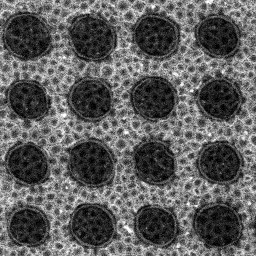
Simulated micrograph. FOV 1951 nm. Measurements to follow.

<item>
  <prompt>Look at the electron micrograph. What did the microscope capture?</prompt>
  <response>a regular array of raised bodies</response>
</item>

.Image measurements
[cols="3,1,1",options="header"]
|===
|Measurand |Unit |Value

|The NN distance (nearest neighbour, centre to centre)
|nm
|476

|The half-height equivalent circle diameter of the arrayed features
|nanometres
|311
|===